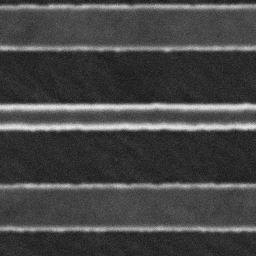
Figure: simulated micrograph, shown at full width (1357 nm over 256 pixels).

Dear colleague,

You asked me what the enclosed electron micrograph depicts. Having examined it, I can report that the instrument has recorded lines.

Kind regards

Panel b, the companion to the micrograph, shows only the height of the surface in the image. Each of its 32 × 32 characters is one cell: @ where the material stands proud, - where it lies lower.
--------------------------------
@@@@@@@@@@@@@@@@@@@@@@@@@@@@@@@@
@@@@@@@@@@@@@@@@@@@@@@@@@@@@@@@@
@@@@@@@@@@@@@@@@@@@@@@@@@@@@@@@@
@@@@@@@@@@@@@@@@@@@@@@@@@@@@@@@@
@@@@@@@@@@@@@@@@@@@@@@@@@@@@@@@@
--------------------------------
--------------------------------
--------------------------------
--------------------------------
--------------------------------
--------------------------------
--------------------------------
@@@@@@@@@@@@@@@@@@@@@@@@@@@@@@@@
@@@@@@@@@@@@@@@@@@@@@@@@@@@@@@@@
@@@@@@@@@@@@@@@@@@@@@@@@@@@@@@@@
--------------------------------
--------------------------------
--------------------------------
--------------------------------
--------------------------------
--------------------------------
--------------------------------
@@@@@@@@@@@@@@@@@@@@@@@@@@@@@@@@
@@@@@@@@@@@@@@@@@@@@@@@@@@@@@@@@
@@@@@@@@@@@@@@@@@@@@@@@@@@@@@@@@
@@@@@@@@@@@@@@@@@@@@@@@@@@@@@@@@
@@@@@@@@@@@@@@@@@@@@@@@@@@@@@@@@
@@@@@@@@@@@@@@@@@@@@@@@@@@@@@@@@
--------------------------------
--------------------------------
--------------------------------